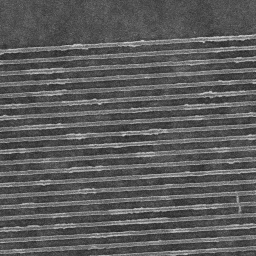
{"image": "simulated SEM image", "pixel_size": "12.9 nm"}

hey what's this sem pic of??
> parallel lines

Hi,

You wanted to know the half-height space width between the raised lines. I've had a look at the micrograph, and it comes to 96.7 nm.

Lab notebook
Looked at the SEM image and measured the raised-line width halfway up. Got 3.37 px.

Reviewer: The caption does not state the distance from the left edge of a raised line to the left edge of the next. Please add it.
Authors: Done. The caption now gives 144 nm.